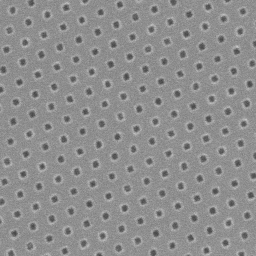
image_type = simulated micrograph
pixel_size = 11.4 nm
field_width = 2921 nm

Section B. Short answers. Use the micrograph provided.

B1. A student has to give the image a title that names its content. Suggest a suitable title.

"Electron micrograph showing a regular array of holes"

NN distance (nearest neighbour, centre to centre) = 19.9 px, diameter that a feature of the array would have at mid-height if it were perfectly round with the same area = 7.22 px